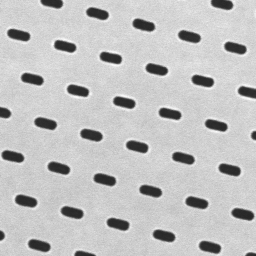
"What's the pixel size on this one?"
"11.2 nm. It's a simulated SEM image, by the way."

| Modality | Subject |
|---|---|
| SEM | a regular array of holes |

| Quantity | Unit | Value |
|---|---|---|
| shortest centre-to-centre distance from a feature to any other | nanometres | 521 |